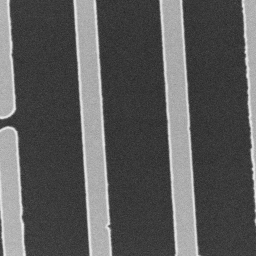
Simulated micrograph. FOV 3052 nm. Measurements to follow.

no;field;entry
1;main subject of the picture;one or a few lines or trenches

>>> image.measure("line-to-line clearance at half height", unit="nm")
779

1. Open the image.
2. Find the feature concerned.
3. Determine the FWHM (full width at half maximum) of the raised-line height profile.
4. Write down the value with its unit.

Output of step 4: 245 nm